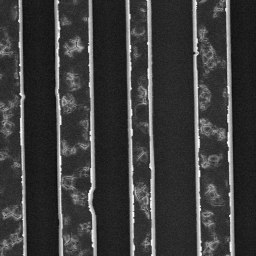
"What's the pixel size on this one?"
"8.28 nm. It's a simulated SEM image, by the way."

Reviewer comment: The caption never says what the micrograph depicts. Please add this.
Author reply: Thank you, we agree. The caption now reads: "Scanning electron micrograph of one or a few lines or trenches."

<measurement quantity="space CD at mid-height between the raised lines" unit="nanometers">298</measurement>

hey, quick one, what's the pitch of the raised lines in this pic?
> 572 nm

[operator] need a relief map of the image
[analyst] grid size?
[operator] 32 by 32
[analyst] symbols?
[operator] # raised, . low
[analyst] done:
###....####.....###.....#####...
###....####.....###.....#####...
###....####.....###.....#####...
###....####.....###.....#####...
###....####.....###.....#####...
###....####.....###.....#####...
###....####.....###.....#####...
###....####.....###.....#####...
###....####.....###.....#####...
###....####.....###.....#####...
###....####.....###.....#####...
###....####.....###.....#####...
###....#####....###.....#####...
###....#####....###.....#####...
###....#####....###......####...
###....#####....###......####...
###....#####....###......####...
###....#####....###......####...
###....#####....###......####...
###....#####....###......####...
###....#####....###......####...
###....#####....###......####...
###....#####....###......####...
###....#####....###......####...
###....####.....###......####...
###....####.....###......####...
###....#####....###......####...
###.....####....###......####...
###.....####....###......####...
###.....####....###......####...
###.....####....###......####...
###.....####....###......####...